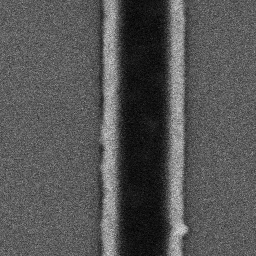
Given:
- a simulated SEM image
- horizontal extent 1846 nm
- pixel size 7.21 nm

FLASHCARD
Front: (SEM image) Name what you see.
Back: one or a few lines or trenches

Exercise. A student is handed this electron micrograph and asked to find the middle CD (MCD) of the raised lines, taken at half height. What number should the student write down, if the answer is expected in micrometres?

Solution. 0.503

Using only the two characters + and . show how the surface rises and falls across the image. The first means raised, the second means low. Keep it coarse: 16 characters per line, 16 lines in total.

.......++++.....
.......++++.....
.......++++.....
.......++++.....
.......++++.....
.......++++.....
.......++++.....
.......++++.....
.......++++.....
.......++++.....
.......++++.....
.......++++.....
.......++++.....
.......++++.....
.......++++.....
.......++++.....